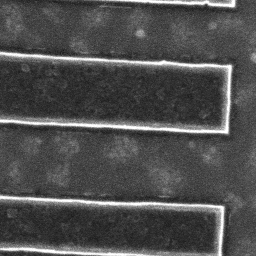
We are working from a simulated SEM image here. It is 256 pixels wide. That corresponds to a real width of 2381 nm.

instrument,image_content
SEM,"one or a few lines or trenches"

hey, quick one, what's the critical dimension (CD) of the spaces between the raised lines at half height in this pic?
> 74.2 pixels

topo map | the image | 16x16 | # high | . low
................
................
................
##..............
##############..
##############..
##############..
##############..
................
................
................
................
####............
##############..
##############..
##############..